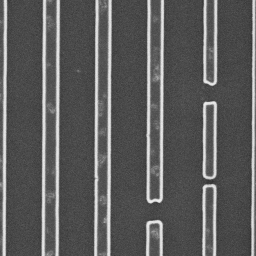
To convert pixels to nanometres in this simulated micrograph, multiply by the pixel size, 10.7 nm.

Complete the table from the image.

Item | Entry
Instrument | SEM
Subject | parallel lines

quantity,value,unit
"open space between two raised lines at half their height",415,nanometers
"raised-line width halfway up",139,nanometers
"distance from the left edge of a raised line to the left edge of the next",0.566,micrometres